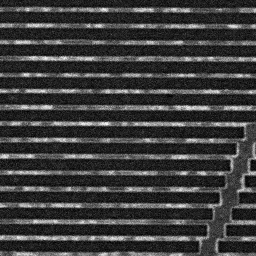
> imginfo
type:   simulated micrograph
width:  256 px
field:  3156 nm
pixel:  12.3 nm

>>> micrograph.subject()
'parallel lines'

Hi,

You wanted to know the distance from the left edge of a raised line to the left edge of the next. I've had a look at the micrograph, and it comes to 16.3 px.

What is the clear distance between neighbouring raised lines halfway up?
162 nm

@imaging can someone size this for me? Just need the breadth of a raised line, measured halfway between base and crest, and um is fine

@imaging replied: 0.0462